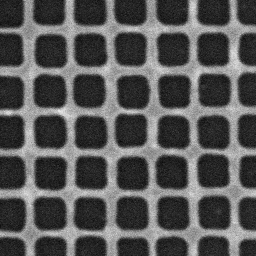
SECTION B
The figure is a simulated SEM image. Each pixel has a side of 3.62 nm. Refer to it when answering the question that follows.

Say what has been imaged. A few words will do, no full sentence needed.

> a regular array of holes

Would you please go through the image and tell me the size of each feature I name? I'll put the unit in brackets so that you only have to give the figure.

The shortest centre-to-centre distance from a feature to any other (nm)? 145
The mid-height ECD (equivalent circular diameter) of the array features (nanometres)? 135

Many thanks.